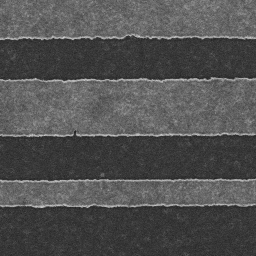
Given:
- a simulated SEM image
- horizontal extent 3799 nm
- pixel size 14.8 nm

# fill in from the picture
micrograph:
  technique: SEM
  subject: one or a few lines or trenches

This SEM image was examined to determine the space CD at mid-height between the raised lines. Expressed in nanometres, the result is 664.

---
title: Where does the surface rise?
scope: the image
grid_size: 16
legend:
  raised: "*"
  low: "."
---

****************
****************
................
................
................
****************
****************
****************
................
................
................
****************
****************
................
................
................